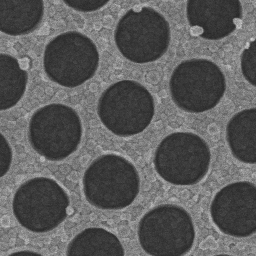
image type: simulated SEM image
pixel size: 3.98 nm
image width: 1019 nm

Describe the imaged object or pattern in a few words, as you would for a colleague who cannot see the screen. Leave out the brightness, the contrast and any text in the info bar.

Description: a regular array of holes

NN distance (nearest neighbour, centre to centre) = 295 nm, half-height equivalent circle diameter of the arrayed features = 217 nm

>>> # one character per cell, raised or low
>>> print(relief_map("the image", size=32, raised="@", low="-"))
-----@@@-----@@@@@@@@@@-------@@
-----@@@@@@@@@@@----@@@-------@@
-----@@@@@@@@@@------@@@-----@@@
----@@@@@@@@@@@------@@@@----@@@
@@@@@@@----@@@-------@@@@---@@@@
@@@@@@------@@@------@@@@@@@@@@-
@@@@@@------@@@------@@@@@@@@@--
--@@@-------@@@@---@@@@@--@@@@--
---@@@------@@@@@@@@@@-----@@@--
---@@@------@@@@@@@@@-------@@--
---@@@@---@@@@---@@@@-------@@@-
---@@@@@@@@@@------@@-------@@@@
--@@@@@@@@@@-------@@@-----@@@@@
-@@@@----@@@-------@@@@----@@@@@
@@@@------@@-------@@@@@@@@@@---
@@@@------@@@------@@@@@@@@@@---
@@@@------@@@@---@@@@@@@@@@@----
-@@@------@@@@@@@@@@-----@@@----
-@@@-----@@@@@@@@@@@------@@@---
-@@@@---@@@@@--@@@@-------@@@---
-@@@@@@@@@@@----@@@-------@@@@@@
-@@@@@@@@@@------@@@------@@@@@@
@@@@---@@@@------@@@@----@@@@@@@
@@------@@@------@@@@@@@@@@@----
@@------@@@------@@@@@@@@@@-----
@@-------@@@----@@@@@@@@@@------
@@------@@@@@@@@@@@----@@@------
@@------@@@@@@@@@@------@@@-----
@@@----@@@@@@@@@@-------@@@-----
@@@@@@@@@@----@@@-------@@@@@--@
@@@@@@@@@------@@@------@@@@@@@@
@@--@@@@-------@@@-----@@@@@@@@@